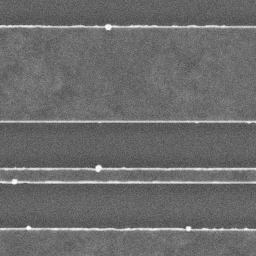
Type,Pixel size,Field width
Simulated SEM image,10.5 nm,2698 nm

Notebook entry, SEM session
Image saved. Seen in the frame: lines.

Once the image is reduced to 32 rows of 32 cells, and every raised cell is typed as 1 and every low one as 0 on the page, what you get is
00000000000000000000000000000000
00000000000000000000000000000000
00000000000000000000000000000000
11111111111111111111111111111111
11111111111111111111111111111111
11111111111111111111111111111111
11111111111111111111111111111111
11111111111111111111111111111111
11111111111111111111111111111111
11111111111111111111111111111111
11111111111111111111111111111111
11111111111111111111111111111111
11111111111111111111111111111111
11111111111111111111111111111111
11111111111111111111111111111111
00000000000000000000000000000000
00000000000000000000000000000000
00000000000000000000000000000000
00000000000000000000000000000000
00000000000000000000000000000000
00000000000000000000000000000000
11111111111111111111111111111111
11111111111111111111111111111111
00000000000000000000000000000000
00000000000000000000000000000000
00000000000000000000000000000000
00000000000000000000000000000000
00000000000000000000000000000000
00010000000000000000000100000000
11111111111111111111111111111111
11111111111111111111111111111111
11111111111111111111111111111111